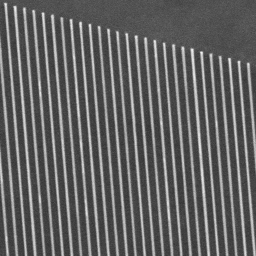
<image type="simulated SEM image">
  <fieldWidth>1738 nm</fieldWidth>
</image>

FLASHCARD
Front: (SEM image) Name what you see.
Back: parallel lines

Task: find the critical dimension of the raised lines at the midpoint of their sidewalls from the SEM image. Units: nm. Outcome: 11.8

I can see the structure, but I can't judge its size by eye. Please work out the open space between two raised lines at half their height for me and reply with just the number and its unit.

48.2 nm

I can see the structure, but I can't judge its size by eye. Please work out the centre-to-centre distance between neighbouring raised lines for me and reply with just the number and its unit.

61.9 nm